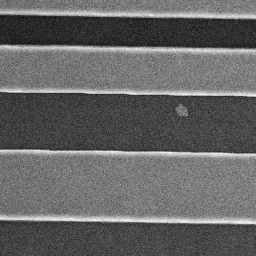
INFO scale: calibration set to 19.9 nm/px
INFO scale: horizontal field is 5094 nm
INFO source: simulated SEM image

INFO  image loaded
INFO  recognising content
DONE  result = lines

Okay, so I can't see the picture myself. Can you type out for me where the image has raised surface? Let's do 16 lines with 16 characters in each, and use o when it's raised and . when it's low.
oooooooooooooooo
................
................
oooooooooooooooo
oooooooooooooooo
oooooooooooooooo
................
................
................
oooooooo........
oooooooooooooooo
oooooooooooooooo
oooooooooooooooo
oooooooooooooooo
................
................